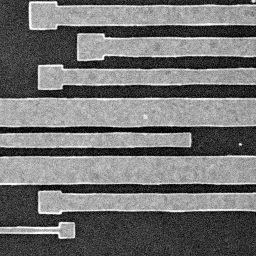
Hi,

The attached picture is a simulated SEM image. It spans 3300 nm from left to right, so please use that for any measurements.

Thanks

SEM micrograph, groups of lines, slits or small figures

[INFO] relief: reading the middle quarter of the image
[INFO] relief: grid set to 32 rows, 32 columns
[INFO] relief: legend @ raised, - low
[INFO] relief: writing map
--------------------------------
@@@@@@@@@@@@@@@@@@@@@@@@@@@@@@@@
@@@@@@@@@@@@@@@@@@@@@@@@@@@@@@@@
@@@@@@@@@@@@@@@@@@@@@@@@@@@@@@@@
@@@@@@@@@@@@@@@@@@@@@@@@@@@@@@@@
--------------------------------
--------------------------------
--------------------------------
--------------------------------
@@@@@@@@@@@@@@@@@@@@@@@@@@@@@@@@
@@@@@@@@@@@@@@@@@@@@@@@@@@@@@@@@
@@@@@@@@@@@@@@@@@@@@@@@@@@@@@@@@
@@@@@@@@@@@@@@@@@@@@@@@@@@@@@@@@
@@@@@@@@@@@@@@@@@@@@@@@@@@@@@@@@
@@@@@@@@@@@@@@@@@@@@@@@@@@@@@@@@
@@@-------@@@@@@@@@@---------@@@
--------------------------------
----------@@@@@@@@@----------@@@
@@@@@@@@@@@@@@@@@@@@@@@@@@@@@@@@
@@@@@@@@@@@@@@@@@@@@@@@@@@@@@@@@
@@@@@@@@@@@@@@@@@@@@@@@------@@@
--------------------------------
--------------------------------
@@@@@@@@@@@@@@@@@@@@@@@@@@@@@@@@
@@@@@@@@@@@@@@@@@@@@@@@@@@@@@@@@
@@@@@@@@@@@@@@@@@@@@@@@@@@@@@@@@
@@@@@@@@@@@@@@@@@@@@@@@@@@@@@@@@
@@@@@@@@@@@@@@@@@@@@@@@@@@@@@@@@
@@@@@@@@@@@@@@@@@@@@@@@@@@@@@@@@
@@@@@@@@@@@@@@@@@@@@@@@@@@@@@@@@
--------------------------------
--------------------------------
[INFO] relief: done